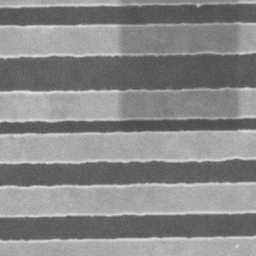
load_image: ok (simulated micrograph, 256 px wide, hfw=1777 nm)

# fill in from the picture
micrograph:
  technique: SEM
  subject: lines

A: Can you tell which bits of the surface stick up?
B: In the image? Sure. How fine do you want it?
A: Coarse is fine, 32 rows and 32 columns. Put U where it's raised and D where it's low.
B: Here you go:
UUUUUUUUUUUUUUUUUUUUUUUDUUDDDDDD
DDDDDDDDDDDDDDDDDDDDDDDDDDDDDDDD
DDDDDDDDDDDDDDDDDDDDDDDDDDDDDDDD
UUUUUUUUUUUUUUUUUUUUUUUUUUUUUUUU
UUUUUUUUUUUUUUUUUUUUUUUUUUUUUUUU
UUUUUUUUUUUUUUUUUUUUUUUUUUUUUUUU
UUUUUUUUUUUUUUUUUUUUUUUUUUUUUUUU
DDDDDDDDDDDDDDDDDDDDDDDDDDDDDDDD
DDDDDDDDDDDDDDDDDDDDDDDDDDDDDDDD
DDDDDDDDDDDDDDDDDDDDDDDDDDDDDDDD
DDDDDDDDDDDDDDDDDDDDDDDDDDDDDDDD
DUUDDDUUUUUUUUUUUUUUUUUUUUUUUUUU
UUUUUUUUUUUUUUUUUUUUUUUUUUUUUUUU
UUUUUUUUUUUUUUUUUUUUUUUUUUUUUUUU
UUUUUUUUUUUUUUUUUUUUUUUUUUUUUUUU
DDDDDDDDDDDDDDDDDDDDDDDDDDDDDDDD
DDDDDDDDDDDDDDDDDDDDDDDUUUUUUUUU
UUUUUUUUUUUUUUUUUUUUUUUUUUUUUUUU
UUUUUUUUUUUUUUUUUUUUUUUUUUUUUUUU
UUUUUUUUUUUUUUUUUUUUUUUUUUUUUUUU
DDDDDDDDDDDDDDDDDDDDDDDDDDDDDDDD
DDDDDDDDDDDDDDDDDDDDDDDDDDDDDDDD
DDDDDDDDDDDDDDDDDDDDDDDDDDDDDDDD
UUUUUUUUUUUUUUUUUUUUUUUUUUUUUUUU
UUUUUUUUUUUUUUUUUUUUUUUUUUUUUUUU
UUUUUUUUUUUUUUUUUUUUUUUUUUUUUUUU
UUUUUUUUUUUUUUUUUUUUUUUUUUUUUUUU
DDDDDDDDDDDDDDDDDDDDDDDDDDDDDDDD
DDDDDDDDDDDDDDDDDDDDDDDDDDDDDDDD
DDDDDDDDDDDDDDDDDDDDDDDDDDDDDDDD
UUUUUUUUUUUUUUUUUUUUUUUUUUUUUUUU
UUUUUUUUUUUUUUUUUUUUUUUUUUUUUUUU